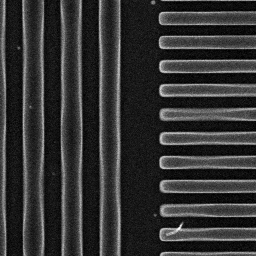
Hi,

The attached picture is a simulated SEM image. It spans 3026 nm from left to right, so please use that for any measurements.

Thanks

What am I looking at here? groups of lines, slits or small figures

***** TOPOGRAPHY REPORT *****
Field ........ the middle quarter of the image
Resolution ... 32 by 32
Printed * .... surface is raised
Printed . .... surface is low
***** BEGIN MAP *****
****.....*****..........********
****.....*****..........********
****.....*****..................
****.....*****..................
****.....*****..................
****.....*****..........********
****.....*****..........********
****.....*****..........********
****.....*****..................
****.....*****..................
****.....*****..................
****.....*****...........*......
****.....*****..........********
****.....*****...........*******
****.....*****..................
****.....*****..................
****.....*****..................
****.....*****...........*******
****.....*****..........********
****.....*****..........********
****.....*****..................
****.....*****..................
****.....*****..................
****.....*****..........********
****.....*****..........********
****.....*****..........********
****.....*****..................
****......****..................
****......****..................
****......****...........*******
****......****..........********
****......****..........********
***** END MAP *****